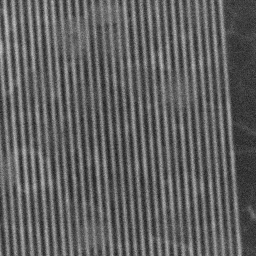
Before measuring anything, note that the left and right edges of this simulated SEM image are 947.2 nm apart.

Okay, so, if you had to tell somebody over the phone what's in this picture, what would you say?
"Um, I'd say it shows parallel lines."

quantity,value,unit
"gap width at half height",23.1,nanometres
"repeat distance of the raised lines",29.5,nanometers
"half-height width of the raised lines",5.1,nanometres